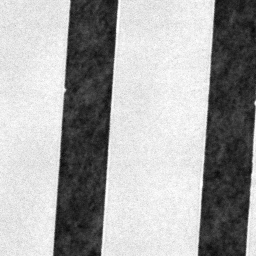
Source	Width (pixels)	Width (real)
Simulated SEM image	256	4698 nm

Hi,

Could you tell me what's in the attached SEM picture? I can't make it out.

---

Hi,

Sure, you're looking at one or a few lines or trenches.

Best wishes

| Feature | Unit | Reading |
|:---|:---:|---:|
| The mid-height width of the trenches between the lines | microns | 0.906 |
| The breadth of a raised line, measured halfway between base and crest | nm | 1740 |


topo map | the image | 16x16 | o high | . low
oooo...oooooo...
oooo...oooooo...
oooo...oooooo...
oooo...oooooo...
oooo...oooooo...
oooo...oooooo...
oooo...oooooo...
oooo...oooooo...
oooo...oooooo...
oooo...oooooo...
oooo...oooooo...
oooo...oooooo...
oooo...oooooo...
ooo....ooooo....
ooo...oooooo...o
ooo...oooooo...o